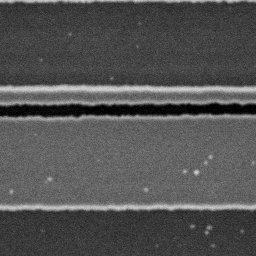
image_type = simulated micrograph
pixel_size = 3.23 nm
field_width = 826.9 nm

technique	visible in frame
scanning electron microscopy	lines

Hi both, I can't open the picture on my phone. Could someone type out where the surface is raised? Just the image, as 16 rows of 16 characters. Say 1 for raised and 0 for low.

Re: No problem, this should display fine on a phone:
0000000000000000
0000000000000000
0000000000000000
0000000000000000
0000000000000000
0000000000000000
1111111111111111
1111111111111111
1111111111111111
1111111111111111
1111111111111111
1111111111111111
1111111111111111
0000000000000000
0000000000000000
0000000000000000